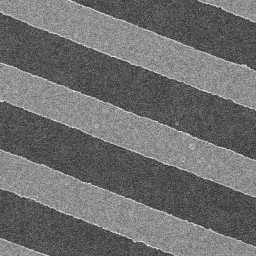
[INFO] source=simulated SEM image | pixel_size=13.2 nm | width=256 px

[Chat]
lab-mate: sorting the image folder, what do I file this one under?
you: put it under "one or a few lines or trenches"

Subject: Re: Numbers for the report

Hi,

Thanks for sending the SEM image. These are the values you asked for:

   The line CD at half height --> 475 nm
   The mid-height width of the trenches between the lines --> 613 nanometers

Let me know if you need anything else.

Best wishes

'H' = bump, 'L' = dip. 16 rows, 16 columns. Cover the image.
HHHHHHLLLLLLLLHH
LLHHHHHHLLLLLLLL
LLLLHHHHHHHLLLLL
LLLLLLLHHHHHHLLL
HHLLLLLLLLHHHHHH
HHHHLLLLLLLLHHHH
LHHHHHHLLLLLLLLH
LLLHHHHHHLLLLLLL
LLLLLLHHHHHHLLLL
LLLLLLLLHHHHHHHL
HHHLLLLLLLLHHHHH
HHHHHHLLLLLLLLHH
LLHHHHHHLLLLLLLL
LLLLHHHHHHHLLLLL
LLLLLLLHHHHHHLLL
HHLLLLLLLLHHHHHH